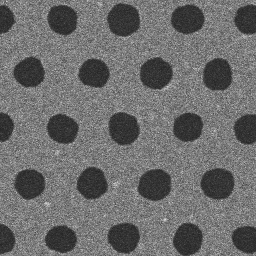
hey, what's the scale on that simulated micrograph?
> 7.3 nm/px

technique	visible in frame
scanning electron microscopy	a regular array of holes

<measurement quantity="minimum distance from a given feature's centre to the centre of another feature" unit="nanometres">447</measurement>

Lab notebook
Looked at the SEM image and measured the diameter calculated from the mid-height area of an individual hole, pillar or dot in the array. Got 230 nm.